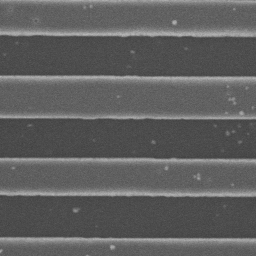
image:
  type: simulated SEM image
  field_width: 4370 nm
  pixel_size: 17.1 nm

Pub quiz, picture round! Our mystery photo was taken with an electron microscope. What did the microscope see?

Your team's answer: lines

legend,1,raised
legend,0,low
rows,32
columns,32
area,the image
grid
11111111111111111111111111111111
11111111111111111111111111111111
11111111111111111111111111111111
11111111111111111111111111111111
00000000000000000000000011000011
00000000000000000000000000000000
00000000000000000000000000000000
00000000000000000000000000000000
00000000000000000000000000000000
00000000000000000000000000000000
11111111111111111111111111111111
11111111111111111111111111111111
11111111111111111111111111111111
11111111111111111111111111111111
11111111111111111111111111111111
00000000000000000000000000000000
00000000000000000000000000000000
00000000000000000000000000000000
00000000000000000000000000000000
00000000000000000000000000000000
11111111111111111111111111111111
11111111111111111111111111111111
11111111111111111111111111111111
11111111111111111111111111111111
00000000000000000000001110011111
00000000000000000000000000000000
00000000000000000000000000000000
00000000000000000000000000000000
00000000000000000000000000000000
00000000000000000000000000000000
11111111111111111111111111111111
11111111111111111111111111111111